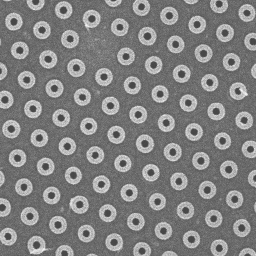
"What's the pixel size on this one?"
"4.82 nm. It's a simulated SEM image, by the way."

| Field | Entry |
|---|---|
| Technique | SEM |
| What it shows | a regular array of ring-shaped raised bodies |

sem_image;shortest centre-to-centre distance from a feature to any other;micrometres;0.14